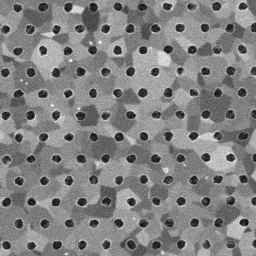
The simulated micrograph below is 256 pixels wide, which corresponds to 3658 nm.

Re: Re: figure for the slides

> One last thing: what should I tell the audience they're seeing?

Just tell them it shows a regular array of holes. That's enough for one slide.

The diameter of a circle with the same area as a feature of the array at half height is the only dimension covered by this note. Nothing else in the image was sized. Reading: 136 nanometers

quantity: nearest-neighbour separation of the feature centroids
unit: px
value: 24.4